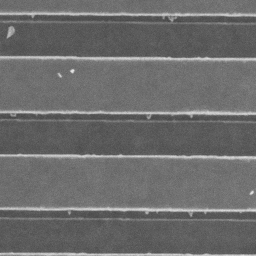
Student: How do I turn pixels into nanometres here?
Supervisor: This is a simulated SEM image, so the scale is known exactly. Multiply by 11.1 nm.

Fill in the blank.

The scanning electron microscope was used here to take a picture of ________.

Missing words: lines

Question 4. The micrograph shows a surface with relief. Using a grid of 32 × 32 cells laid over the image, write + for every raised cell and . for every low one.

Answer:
++++++++++++++++++++++++++++++++
++++++++++++++++++++++++++++++++
................................
................................
................................
................................
................................
++++++++++++++++++++++++++++++++
++++++++++++++++++++++++++++++++
++++++++++++++++++++++++++++++++
++++++++++++++++++++++++++++++++
++++++++++++++++++++++++++++++++
++++++++++++++++++++++++++++++++
++++++++++++++++++++++++++++++++
................................
................................
................................
................................
................................
++++++++++++++++++++++++++++....
++++++++++++++++++++++++++++++++
++++++++++++++++++++++++++++++++
++++++++++++++++++++++++++++++++
++++++++++++++++++++++++++++++++
++++++++++++++++++++++++++++++++
++++++++++++++++++++++++++++++++
................................
................................
................................
................................
................................
................................